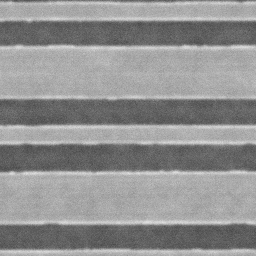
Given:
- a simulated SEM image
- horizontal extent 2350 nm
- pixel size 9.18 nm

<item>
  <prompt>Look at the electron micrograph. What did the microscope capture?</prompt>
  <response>lines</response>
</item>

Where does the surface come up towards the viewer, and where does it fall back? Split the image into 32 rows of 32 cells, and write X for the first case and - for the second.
XXXXXXXXXXXXXXXXXXXXXXXXXXXXXXXX
XXXXXXXXXXXXXXXXXXXXXXXXXXXXXXXX
--------------------------------
--------------------------------
--------------------------------
--------------------------------
XXXXXXXXXXXXXXXXXXXXXXXXXXXXXXXX
XXXXXXXXXXXXXXXXXXXXXXXXXXXXXXXX
XXXXXXXXXXXXXXXXXXXXXXXXXXXXXXXX
XXXXXXXXXXXXXXXXXXXXXXXXXXXXXXXX
XXXXXXXXXXXXXXXXXXXXXXXXXXXXXXXX
XXXXXXXXXXXXXXXXXXXXXXXXXXXXXXXX
--------------------------------
--------------------------------
--------------------------------
--------------------------------
XXXXXXXXXXXXXXXXXXXXXXXXXXXXXXXX
XXXXXXXXXXXXXXXXXXXXXXXXXXXXXXXX
--------------------------------
--------------------------------
--------------------------------
--------------------XX------XX--
XXXXXXXXXXXXXXXXXXXXXXXXXXXXXXXX
XXXXXXXXXXXXXXXXXXXXXXXXXXXXXXXX
XXXXXXXXXXXXXXXXXXXXXXXXXXXXXXXX
XXXXXXXXXXXXXXXXXXXXXXXXXXXXXXXX
XXXXXXXXXXXXXXXXXXXXXXXXXXXXXXXX
XXXXXXXXXXXXXXXXXXXXXXXXXXXXXXXX
--------------------------------
--------------------------------
--------------------------------
XXXXXXXXXXXXXXXXXXXXXXXXXXXXXXXX